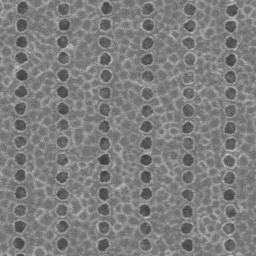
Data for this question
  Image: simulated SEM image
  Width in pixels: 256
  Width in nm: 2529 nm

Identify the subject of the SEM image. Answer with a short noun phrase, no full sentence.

a regular array of holes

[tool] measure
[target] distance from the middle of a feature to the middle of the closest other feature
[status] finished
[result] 162 nanometers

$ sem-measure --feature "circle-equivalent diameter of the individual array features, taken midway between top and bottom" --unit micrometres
0.124